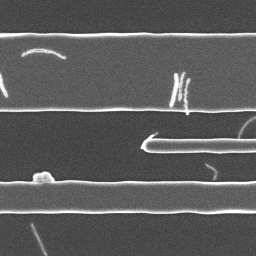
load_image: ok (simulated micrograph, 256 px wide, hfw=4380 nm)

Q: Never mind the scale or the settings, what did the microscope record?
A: groups of lines, slits or small figures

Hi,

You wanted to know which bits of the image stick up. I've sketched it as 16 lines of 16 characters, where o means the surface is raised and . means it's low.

................
................
oooooooooooooooo
oooooooooooooooo
oooooooooooooooo
oooooooooooooooo
oooooooooooooooo
................
................
..........o..oo.
................
oooooooooooooooo
oooooooooooooooo
................
................
................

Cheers